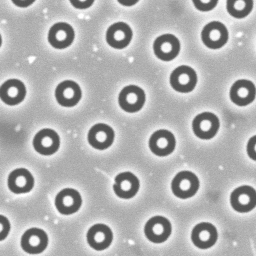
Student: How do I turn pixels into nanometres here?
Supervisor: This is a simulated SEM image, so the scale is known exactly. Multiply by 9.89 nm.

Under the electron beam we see a regular array of ring-shaped grooves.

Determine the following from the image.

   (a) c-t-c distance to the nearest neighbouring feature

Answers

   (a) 47.2 pixels